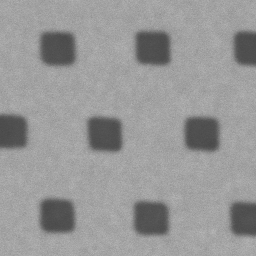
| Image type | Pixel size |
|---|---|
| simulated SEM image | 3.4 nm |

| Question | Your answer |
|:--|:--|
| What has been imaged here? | holes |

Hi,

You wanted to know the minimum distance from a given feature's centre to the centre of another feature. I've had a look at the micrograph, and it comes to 322 nm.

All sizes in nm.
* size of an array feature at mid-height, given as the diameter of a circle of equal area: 123